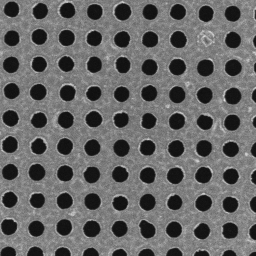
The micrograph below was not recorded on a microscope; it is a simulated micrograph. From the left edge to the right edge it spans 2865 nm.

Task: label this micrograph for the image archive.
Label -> a regular array of holes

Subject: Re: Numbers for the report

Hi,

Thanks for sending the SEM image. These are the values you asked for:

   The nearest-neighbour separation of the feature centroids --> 297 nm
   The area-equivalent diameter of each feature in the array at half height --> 182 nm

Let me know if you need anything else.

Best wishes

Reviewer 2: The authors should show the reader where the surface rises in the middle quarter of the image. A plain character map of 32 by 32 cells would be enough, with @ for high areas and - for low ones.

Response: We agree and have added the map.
---@@@----@@@----@@----@@@-----@
--@@@@---@@@@---@@@----@@@----@@
@@@@@@@@@@@@@@@@@@@@---@@@@---@@
@@@@@@@@@@@@@@@@@@@@@@@@@@@@@@@@
@@@@@@@@@@@@@@@@@@@@@@@@@@@@@@@@
--@@@@@-@@@@@@@@@@@@@-@@@@@@-@@@
---@@@---@@@@---@@@----@@@@---@@
---@@----@@@----@@@----@@@----@@
---@@@---@@@@---@@@@---@@@----@@
@@@@@@@@@@@@@@@@@@@@@@@@@@@--@@@
@@@@@@@@@@@@@@@@@@@@@@@@@@@@@@@@
@@@@@@@@@@@@@@@@@@@@@@@@@@@@@@@@
--@@@@---@@@@---@@@@--@@@@@--@@@
--@@@-----@@----@@@----@@@----@@
--@@@----@@@----@@@----@@@----@@
--@@@@---@@@@--@@@@----@@@----@@
@@@@@@@@@@@@@@@@@@@@@@@@@@@@@@@@
@@@@@@@@@@@@@@@@@@@@@@@@@@@@@@@@
@@@@@@@@@@@@@@@@@@@@@@@@@@@@@@@@
--@@@@---@@@@---@@@@--@@@@@--@@@
--@@@----@@@----@@@----@@@----@@
--@@@----@@@----@@@----@@@----@@
-@@@@@--@@@@@---@@@@--@@@@@---@@
@@@@@@@@@@@@@@@@@@@@@@@@@@@@@@@@
@@@@@@@@@@@@@@@@@@@@@@@@@@@@@@@@
-@@@@@@@@@@@@@@@@@@@@@@@@@@@@@@@
--@@@----@@@----@@@---@@@@---@@@
--@@@----@@@----@@@----@@@----@@
--@@@----@@@----@@@----@@@----@@
@@@@@@--@@@@@-@@@@@@--@@@@---@@@
@@@@@@@@@@@@@@@@@@@@@@@@@@@@@@@@
@@@@@@@@@@@@@@@@@@@@@@@@@@@@@@@@